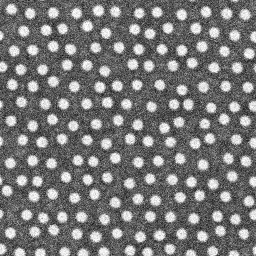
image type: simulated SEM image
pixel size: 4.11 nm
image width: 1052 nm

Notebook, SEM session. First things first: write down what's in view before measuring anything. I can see a regular array of raised bodies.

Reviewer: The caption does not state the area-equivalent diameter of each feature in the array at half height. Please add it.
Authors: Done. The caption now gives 9.78 px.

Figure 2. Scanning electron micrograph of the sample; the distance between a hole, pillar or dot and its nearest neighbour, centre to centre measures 72.1 nanometers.